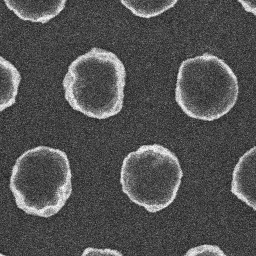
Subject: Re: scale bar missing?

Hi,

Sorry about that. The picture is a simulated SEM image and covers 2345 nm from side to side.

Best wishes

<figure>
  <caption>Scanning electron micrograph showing raised bodies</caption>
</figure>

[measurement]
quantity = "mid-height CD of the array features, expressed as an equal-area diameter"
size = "572 nm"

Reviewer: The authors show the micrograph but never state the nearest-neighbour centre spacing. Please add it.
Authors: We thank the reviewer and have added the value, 974 nm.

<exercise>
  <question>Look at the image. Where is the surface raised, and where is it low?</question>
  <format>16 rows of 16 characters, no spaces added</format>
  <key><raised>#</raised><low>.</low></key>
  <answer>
.###....###.....
................
................
.....##.........
#...####...####.
#...####...####.
.....###...####.
................
................
..##....##.....#
.###....###....#
.###....###....#
.###....###....#
................
................
............#...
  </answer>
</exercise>